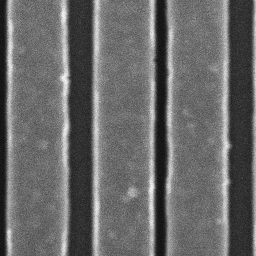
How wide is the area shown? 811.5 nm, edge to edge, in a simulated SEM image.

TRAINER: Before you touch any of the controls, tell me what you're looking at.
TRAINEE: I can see one or a few lines or trenches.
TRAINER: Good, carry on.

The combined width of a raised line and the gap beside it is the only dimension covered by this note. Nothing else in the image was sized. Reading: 254 nm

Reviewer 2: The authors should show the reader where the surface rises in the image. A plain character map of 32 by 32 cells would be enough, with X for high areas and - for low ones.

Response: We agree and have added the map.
-XXXXXXX----XXXXXXX--XXXXXXX----
-XXXXXXX----XXXXXXX--XXXXXXX----
-XXXXXXX----XXXXXXX--XXXXXXX----
-XXXXXXX----XXXXXXX--XXXXXXX----
-XXXXXXX----XXXXXXX--XXXXXXX----
-XXXXXXX----XXXXXXX--XXXXXXXX---
-XXXXXXX----XXXXXXX--XXXXXXXX---
-XXXXXXX----XXXXXXX--XXXXXXXX---
-XXXXXXXX---XXXXXXX--XXXXXXXX---
-XXXXXXXX---XXXXXXX--XXXXXXXX---
-XXXXXXXX---XXXXXXX--XXXXXXXX---
-XXXXXXXX---XXXXXXX--XXXXXXXX---
-XXXXXXX----XXXXXXX--XXXXXXX----
-XXXXXXX----XXXXXXX--XXXXXXX----
-XXXXXXXX---XXXXXXX--XXXXXXX----
-XXXXXXXX---XXXXXXX--XXXXXXX----
-XXXXXXXX---XXXXXXX--XXXXXXX----
-XXXXXXXX---XXXXXXX--XXXXXXX----
-XXXXXXXX---XXXXXXX--XXXXXXXX---
-XXXXXXX----XXXXXXX--XXXXXXX----
-XXXXXXX----XXXXXXX--XXXXXXX----
-XXXXXXX----XXXXXXX--XXXXXXX----
-XXXXXXX----XXXXXXX--XXXXXXXX---
-XXXXXXX----XXXXXXX--XXXXXXX----
-XXXXXXX----XXXXXXX--XXXXXXX----
-XXXXXXX----XXXXXXX--XXXXXXX----
-XXXXXXX----XXXXXXX--XXXXXXX----
-XXXXXXX----XXXXXXX--XXXXXXX----
-XXXXXXX----XXXXXXX--XXXXXXX----
-XXXXXXX----XXXXXXX--XXXXXXX----
-XXXXXXX----XXXXXXX--XXXXXXX----
-XXXXXXX----XXXXXXX--XXXXXXX----